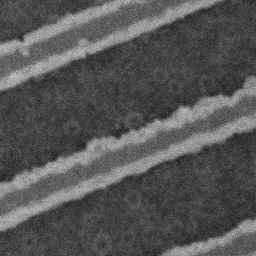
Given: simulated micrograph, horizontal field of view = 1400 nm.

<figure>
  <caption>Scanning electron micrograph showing one or a few lines or trenches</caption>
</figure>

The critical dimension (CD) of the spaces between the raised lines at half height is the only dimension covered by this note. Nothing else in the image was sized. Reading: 516 nanometres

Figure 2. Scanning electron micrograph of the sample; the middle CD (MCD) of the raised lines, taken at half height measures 179 nanometers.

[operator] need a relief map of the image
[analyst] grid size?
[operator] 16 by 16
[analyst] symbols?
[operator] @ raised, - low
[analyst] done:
-------@@@@@----
----@@@@@@------
--@@@@@---------
@@@@@-----------
@@--------------
----------------
-------------@@@
-----------@@@@@
--------@@@@@@--
-----@@@@@@-----
---@@@@@@-------
@@@@@@----------
@@@-------------
@---------------
--------------@@
------------@@@@